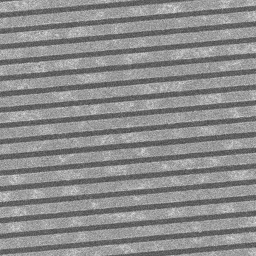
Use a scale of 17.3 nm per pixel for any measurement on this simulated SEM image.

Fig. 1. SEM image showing parallel lines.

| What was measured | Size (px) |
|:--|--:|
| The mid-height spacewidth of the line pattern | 6.35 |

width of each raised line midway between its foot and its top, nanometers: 166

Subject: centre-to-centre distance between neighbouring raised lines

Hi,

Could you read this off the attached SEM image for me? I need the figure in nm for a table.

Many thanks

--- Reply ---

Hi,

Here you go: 272